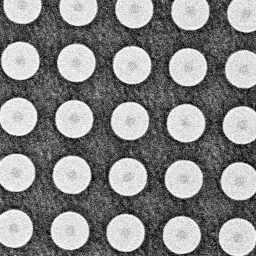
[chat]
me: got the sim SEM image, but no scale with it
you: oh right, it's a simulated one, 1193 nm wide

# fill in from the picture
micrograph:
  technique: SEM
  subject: an array of small figures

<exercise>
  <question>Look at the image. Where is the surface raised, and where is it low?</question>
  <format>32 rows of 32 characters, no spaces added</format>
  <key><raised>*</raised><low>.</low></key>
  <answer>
.****...****...****...****...***
.****...****...****...****..****
.***....***....****...****...***
.......................**....***
................................
..**............................
.****...***....***....***.....*.
*****..*****..*****..*****...***
*****..*****..*****..*****..****
.***....***....***...*****..****
.......................*.....***
................................
.**.............................
****...****....***....***....**.
*****..*****..****...****...****
****...****...****...*****..****
.***....***...****...****...****
......................**.....***
................................
.**.............................
****...****...****....**.....**.
****...****...****...****...****
****...****...****...****...****
.**....****...****...****...****
......................**.....**.
................................
.**.............................
****...****...***....***.....**.
****..*****..*****...****...****
****..*****..*****..*****..*****
***....***....****...****...****
......................**....***.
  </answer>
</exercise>